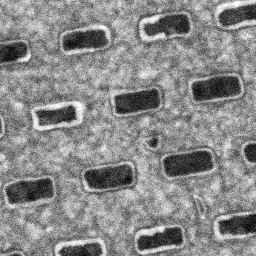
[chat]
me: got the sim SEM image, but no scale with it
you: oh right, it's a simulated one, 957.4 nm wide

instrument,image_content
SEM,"a regular array of raised bodies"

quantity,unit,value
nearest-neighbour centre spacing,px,80.2